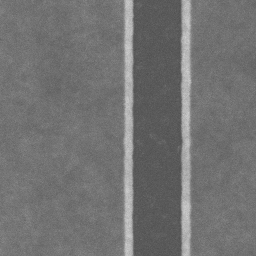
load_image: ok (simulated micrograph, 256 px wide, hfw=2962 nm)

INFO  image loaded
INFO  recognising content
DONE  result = one or a few lines or trenches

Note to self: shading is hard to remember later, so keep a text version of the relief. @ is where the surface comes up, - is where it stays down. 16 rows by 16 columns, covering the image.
@@@@@@@@----@@@@
@@@@@@@@----@@@@
@@@@@@@@----@@@@
@@@@@@@@----@@@@
@@@@@@@@----@@@@
@@@@@@@@----@@@@
@@@@@@@@----@@@@
@@@@@@@@----@@@@
@@@@@@@@----@@@@
@@@@@@@@----@@@@
@@@@@@@@----@@@@
@@@@@@@@----@@@@
@@@@@@@@----@@@@
@@@@@@@@----@@@@
@@@@@@@@----@@@@
@@@@@@@@----@@@@